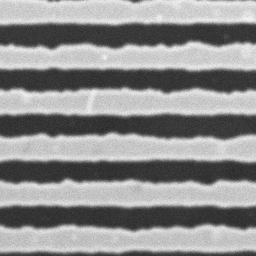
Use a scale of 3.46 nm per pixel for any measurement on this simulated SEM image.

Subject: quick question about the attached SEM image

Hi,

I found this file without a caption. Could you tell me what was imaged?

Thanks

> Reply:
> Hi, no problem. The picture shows lines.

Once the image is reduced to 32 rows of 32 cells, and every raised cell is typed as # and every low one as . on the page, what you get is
################################
################################
################################
................................
................................
.......................##....##.
################################
################################
################################
................................
................................
####################..#####..###
################################
################################
................................
................................
................................
############################.###
################################
################################
................................
................................
........#.......................
################################
################################
################################
................................
................................
#..#..#######......#.##.#####..#
################################
################################
.......##..#..#.................